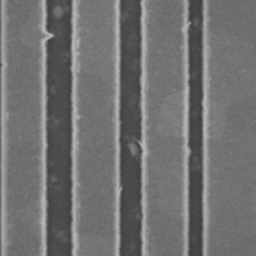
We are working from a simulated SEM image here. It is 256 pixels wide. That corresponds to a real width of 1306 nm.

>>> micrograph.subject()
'one or a few lines or trenches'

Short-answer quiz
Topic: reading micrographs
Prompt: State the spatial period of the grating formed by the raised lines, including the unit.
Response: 70.7 pixels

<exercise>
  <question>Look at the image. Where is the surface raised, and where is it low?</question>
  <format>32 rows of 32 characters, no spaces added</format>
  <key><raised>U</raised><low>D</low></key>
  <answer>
UUUUUDDDDUUUUUUDDDUUUUUDDDUUUUUU
UUUUUUDDDUUUUUUDDDUUUUUDDDUUUUUU
UUUUUDDDDUUUUUUDDDUUUUUDDDUUUUUU
UUUUUDDDDUUUUUUDDDUUUUUDDDUUUUUU
UUUUUUDDDUUUUUUDDDUUUUUDDDUUUUUU
UUUUUDDDDUUUUUUDDDUUUUUDDDUUUUUU
UUUUUUDDDUUUUUUDDDUUUUUDDDUUUUUU
UUUUUDDDDUUUUUUDDDUUUUUDDDUUUUUU
UUUUUDDDDUUUUUUDDDUUUUUDDDUUUUUU
UUUUUDDDDUUUUUUDDDUUUUUDDDUUUUUU
UUUUUDDDDUUUUUUDDDUUUUUDDDUUUUUU
UUUUUDDDDUUUUUUDDDUUUUUDDDUUUUUU
UUUUUDDDDUUUUUUDDDUUUUUDDDUUUUUU
UUUUUUDDDUUUUUUDDDUUUUUDDDUUUUUU
UUUUUDDDDUUUUUUDDDUUUUUDDDUUUUUU
UUUUUUDDDUUUUUUDDDUUUUUDDDUUUUUU
UUUUUDDDDUUUUUUDDDUUUUUDDDUUUUUU
UUUUUUDDDUUUUUUDDDUUUUUDDDUUUUUU
UUUUUUDDDUUUUUUDDDUUUUUDDDUUUUUU
UUUUUDDDDUUUUUUDDDUUUUUDDDUUUUUU
UUUUUUDDDUUUUUUDDDUUUUUDDDUUUUUU
UUUUUUDDDUUUUUUDDDUUUUUDDDUUUUUU
UUUUUDDDDUUUUUUDDDUUUUUDDDUUUUUU
UUUUUUDDDUUUUUUDDDUUUUUDDDUUUUUU
UUUUUDDDDUUUUUUDDDUUUUUDDDUUUUUU
UUUUUDDDDUUUUUUDDDUUUUUDDDUUUUUU
UUUUUUDDDUUUUUUDDDUUUUUDDDUUUUUU
UUUUUDDDDUUUUUUDDDUUUUUDDDUUUUUU
UUUUUDDDDUUUUUUDDDUUUUUDDDUUUUUU
UUUUUDDDDUUUUUUDDDUUUUUDDDUUUUUU
UUUUUUDDDUUUUUUDDDUUUUUDDDUUUUUU
UUUUUUDDDUUUUUUDDDUUUUUDDDUUUUUU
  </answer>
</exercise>